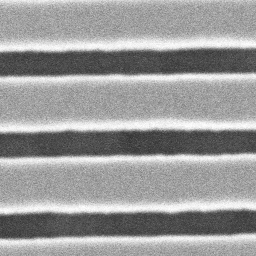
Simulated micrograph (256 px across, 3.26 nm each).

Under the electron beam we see lines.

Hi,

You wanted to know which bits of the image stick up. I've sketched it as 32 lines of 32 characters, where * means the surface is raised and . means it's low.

********************************
********************************
********************************
********************************
********************************
********************************
................................
................................
................................
..............*..***************
********************************
********************************
********************************
********************************
********************************
********************************
................................
................................
................................
......................**...*****
********************************
********************************
********************************
********************************
********************************
********************************
****....**...*.......*..........
................................
................................
.............................***
********************************
********************************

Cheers